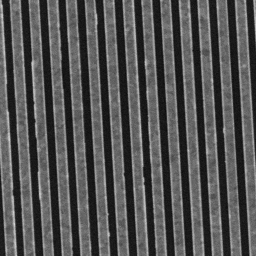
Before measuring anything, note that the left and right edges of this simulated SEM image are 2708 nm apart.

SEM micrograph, parallel lines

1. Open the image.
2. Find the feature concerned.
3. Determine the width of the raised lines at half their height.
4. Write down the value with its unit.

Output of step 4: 102 nm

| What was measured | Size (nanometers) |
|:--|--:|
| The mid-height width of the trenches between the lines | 102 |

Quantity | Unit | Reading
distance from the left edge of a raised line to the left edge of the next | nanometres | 198